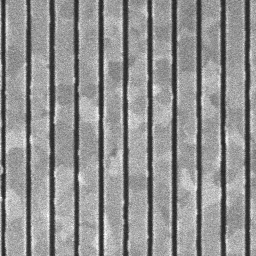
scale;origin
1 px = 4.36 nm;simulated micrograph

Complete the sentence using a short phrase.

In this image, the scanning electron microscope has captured parallel lines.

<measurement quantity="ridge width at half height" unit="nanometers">81.8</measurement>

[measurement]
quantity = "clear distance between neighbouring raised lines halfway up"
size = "5.39 px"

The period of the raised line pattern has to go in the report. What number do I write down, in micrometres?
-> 0.106